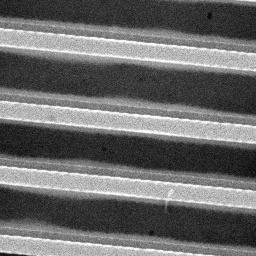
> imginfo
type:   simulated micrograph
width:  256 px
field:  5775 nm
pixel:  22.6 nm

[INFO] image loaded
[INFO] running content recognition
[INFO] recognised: lines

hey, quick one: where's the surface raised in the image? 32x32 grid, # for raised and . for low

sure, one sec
................................
................................
................................
##########......................
####################............
##############################..
........########################
..................##############
............................####
................................
................................
................................
#########.......................
###################.............
#############################...
.......#########################
.................###############
............................####
................................
................................
########........................
##################..............
#############################...
......##########################
................################
..........................######
................................
................................
##..............................
############....................
######################..........
################################